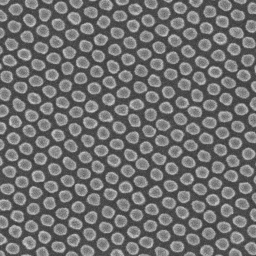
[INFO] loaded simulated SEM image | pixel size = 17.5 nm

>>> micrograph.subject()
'a regular array of raised bodies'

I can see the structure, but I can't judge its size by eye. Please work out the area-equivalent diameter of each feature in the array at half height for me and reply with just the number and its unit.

0.213 micrometres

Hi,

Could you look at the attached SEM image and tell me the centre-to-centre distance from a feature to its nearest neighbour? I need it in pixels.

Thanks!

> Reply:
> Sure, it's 16.1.